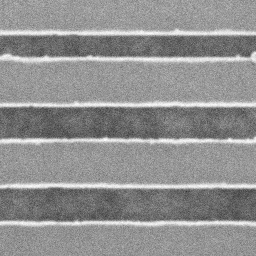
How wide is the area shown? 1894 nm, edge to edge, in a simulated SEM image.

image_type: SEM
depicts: lines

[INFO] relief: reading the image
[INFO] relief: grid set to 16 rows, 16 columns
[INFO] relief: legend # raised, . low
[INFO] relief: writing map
################
################
................
................
################
################
################
................
................
################
################
################
................
................
################
################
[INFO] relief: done